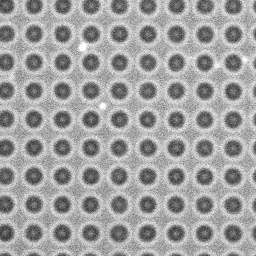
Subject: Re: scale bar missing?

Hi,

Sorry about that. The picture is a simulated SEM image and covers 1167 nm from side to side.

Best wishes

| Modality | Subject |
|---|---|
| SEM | an array of small figures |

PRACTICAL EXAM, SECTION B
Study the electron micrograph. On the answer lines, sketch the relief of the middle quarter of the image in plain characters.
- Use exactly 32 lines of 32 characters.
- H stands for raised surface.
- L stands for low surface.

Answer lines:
LLHHLLLLLHHHLLLLHHHLLLLHHHLLLLHH
LHHHHLLLHHHHLLLHHHHHLLLHHHLLLLHH
HHHHHHHHHHHHHHHHHHHHHHHHHHHHHHHH
HHHHHHHHHHHHHHHHHHHHHHHHHHHHHHHH
LHHHHHLLHHHHHLLHHHHHLLHHHHHLLHHH
LLHHHLLLLHHHLLLLHHHLLLLHHHLLLLHH
LLHHLLLLLHHLLLLLHHHLLLLHHHLLLLLH
LLHHLLLLLHHLLLLLHHHLLLLHHHLLLLHH
LHHHHLLLHHHHLLLLHHHLLLLHHHLLLLHH
HHHHHHHHHHHHHHHHHHHHHHHHHHHHHHHH
HHHHHHHHHHHHHHHHHHHHHHHHHHHHHHHH
HHHHHHLHHHHHHLHHHHHHHHHHHHHHHHHH
LLHHHLLLLHHHLLLLHHHLLLLHHHLLLLHH
LLHHLLLLLHHLLLLLHHHLLLLHHHLLLLHH
LLHHLLLLLHHHLLLLHHHLLLLHHHLLLLHH
LHHHHLLLLHHHLLLLHHHLLLLHHHLLLLHH
HHHHHHHHHHHHHHHHHHHHHHHHHHHHHHHH
HHHHHHHHHHHHHHHHHHHHHHHHHHHHHHHH
HHHHHHHHHHHHHHHHHHHHHHHHHHHHHHHH
LLHHHLLLLHHHLLLLHHHLLLLHHHLLLLHH
LLHHLLLLLHHLLLLLHHHLLLLHHHLLLLHH
LLHHLLLLLHHHLLLLHHHLLLLHHHLLLLHH
LHHHHLLLLHHHLLLLHHHLLLLHHHLLLLHH
HHHHHHLHHHHHHHHHHHHHHHHHHHHHHHHH
HHHHHHHHHHHHHHHHHHHHHHHHHHHHHHHH
HHHHHHHHHHHHHHHHHHHHHHHHHHHHHHHH
LHHHHLLLLHHHLLLLHHHLLLLHHHLLLLHH
LLHHLLLLLHHLLLLLHHHLLLLHHHLLLLHH
LLHHLLLLLHHLLLLLHHLLLLLHHHLLLLHH
LLHHHLLLLHHHLLLLHHHLLLLHHHLLLLHH
HHHHHHLHHHHHHLHHHHHHLHHHHHHLLHHH
HHHHHHHHHHHHHHHHHHHHHHHHHHHHHHHH